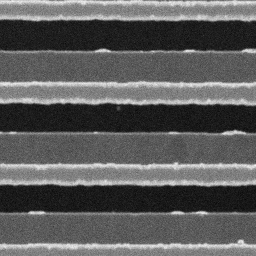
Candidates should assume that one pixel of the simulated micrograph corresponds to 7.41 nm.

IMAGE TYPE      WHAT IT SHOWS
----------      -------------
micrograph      lines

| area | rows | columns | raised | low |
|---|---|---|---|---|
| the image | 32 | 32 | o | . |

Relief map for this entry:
oooooooooooooooooooooooooooooooo
oooooooooooooooooooooooooooooooo
....o................oo...o...oo
................................
................................
................................
o.ooooooo..ooo...oooooooo.o...oo
oooooooooooooooooooooooooooooooo
oooooooooooooooooooooooooooooooo
oooooooooooooooooooooooooooooooo
oooooooooooooooooooooooooooooooo
oooooooooooooooooooooooooooooooo
oooooooooooooooooooooooooooooooo
................................
................................
................................
............................oo..
oooooooooooooooooooooooooooooooo
oooooooooooooooooooooooooooooooo
oooooooooooooooooooooooooooooooo
oooooooooooooooooooooooooooooooo
oooooooooooooooooooooooooooooooo
oooooooooooooooooooooooooooooooo
................................
................................
................................
....oo................o.oo......
oooooooooooooooooooooooooooooooo
oooooooooooooooooooooooooooooooo
oooooooooooooooooooooooooooooooo
oooooooooooooooooooooooooooooooo
oooooooooooooooooooooooooooooooo